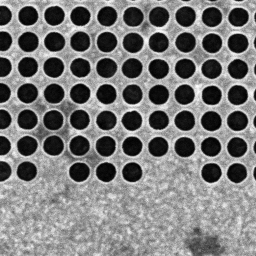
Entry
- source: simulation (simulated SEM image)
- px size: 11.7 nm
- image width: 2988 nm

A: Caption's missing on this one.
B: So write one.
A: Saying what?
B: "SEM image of a regular array of holes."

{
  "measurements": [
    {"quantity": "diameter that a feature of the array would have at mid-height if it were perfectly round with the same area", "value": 239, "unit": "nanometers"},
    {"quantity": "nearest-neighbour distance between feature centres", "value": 0.301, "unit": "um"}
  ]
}